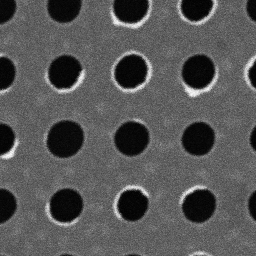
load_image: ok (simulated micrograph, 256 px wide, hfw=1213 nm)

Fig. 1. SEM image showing a regular array of holes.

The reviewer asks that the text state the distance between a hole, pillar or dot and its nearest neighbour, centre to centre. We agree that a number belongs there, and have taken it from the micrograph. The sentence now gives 315 nm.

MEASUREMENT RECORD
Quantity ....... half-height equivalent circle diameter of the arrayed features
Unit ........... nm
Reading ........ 163